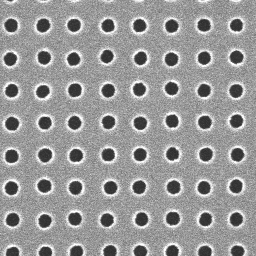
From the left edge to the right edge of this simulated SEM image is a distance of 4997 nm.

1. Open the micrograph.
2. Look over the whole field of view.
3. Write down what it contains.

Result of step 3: a regular array of holes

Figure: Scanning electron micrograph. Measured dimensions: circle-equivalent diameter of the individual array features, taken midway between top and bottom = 14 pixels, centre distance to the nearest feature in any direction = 607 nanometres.